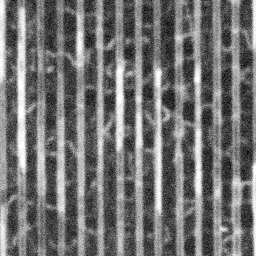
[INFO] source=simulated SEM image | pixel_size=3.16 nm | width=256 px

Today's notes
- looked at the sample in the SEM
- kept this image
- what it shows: parallel lines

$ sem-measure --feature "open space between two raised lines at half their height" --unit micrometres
0.0435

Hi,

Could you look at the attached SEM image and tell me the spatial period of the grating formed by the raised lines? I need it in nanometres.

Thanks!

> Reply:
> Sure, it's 61.5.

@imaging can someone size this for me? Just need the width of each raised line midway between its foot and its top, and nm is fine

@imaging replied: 18.6